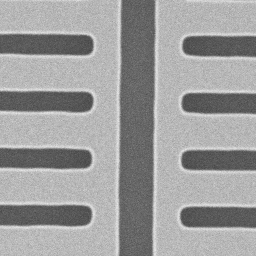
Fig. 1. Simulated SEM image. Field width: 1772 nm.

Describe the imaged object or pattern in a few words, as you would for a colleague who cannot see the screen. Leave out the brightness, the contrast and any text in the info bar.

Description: groups of lines, slits or small figures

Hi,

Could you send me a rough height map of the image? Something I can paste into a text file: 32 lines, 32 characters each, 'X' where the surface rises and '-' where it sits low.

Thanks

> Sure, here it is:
XXXXXXXXXXXXXXX----XXXXXXXXXXXXX
XXXXXXXXXXXXXXX----XXXXXXXXXXXXX
XXXXXXXXXXXXXXX----XXXXXXXXXXXXX
XXXXXXXXXXXXXXX----XXXXXXXXXXXXX
-----------XXXX----XXXXX--------
------------XXX----XXXX---------
------------XXX----XXXX---------
XXXXXXXXXXXXXXX----XXXXXXXXXXXXX
XXXXXXXXXXXXXXX----XXXXXXXXXXXXX
XXXXXXXXXXXXXXX----XXXXXXXXXXXXX
XXXXXXXXXXXXXXX----XXXXXXXXXXXXX
-----------XXXX----XXXXXXXXXXXXX
------------XXX----XXXX---------
------------XXX----XXXX---------
XXXXXXXXXXXXXXX----XXXXXXXXXXXXX
XXXXXXXXXXXXXXX----XXXXXXXXXXXXX
XXXXXXXXXXXXXXX----XXXXXXXXXXXXX
XXXXXXXXXXXXXXX----XXXXXXXXXXXXX
---XXX-XXXXXXXX----XXXXXXXXXXXXX
------------XXX----XXXX---------
-----------XXXX----XXXX---------
XXXXXXXXXXXXXXX----XXXXXXXXXXXXX
XXXXXXXXXXXXXXX----XXXXXXXXXXXXX
XXXXXXXXXXXXXXX----XXXXXXXXXXXXX
XXXXXXXXXXXXXXX----XXXXXXXXXXXXX
XXXXXXXXXXXXXXX----XXXXXXXXXXXXX
------------XXX----XXXX---------
-----------XXXX----XXXX---------
XXXXXXXXXXXXXXX----XXXXXXXXXXXX-
XXXXXXXXXXXXXXX----XXXXXXXXXXXXX
XXXXXXXXXXXXXXX----XXXXXXXXXXXXX
XXXXXXXXXXXXXXX----XXXXXXXXXXXXX